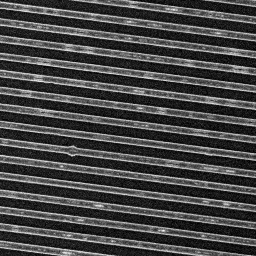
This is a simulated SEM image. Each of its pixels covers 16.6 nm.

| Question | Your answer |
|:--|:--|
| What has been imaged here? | parallel lines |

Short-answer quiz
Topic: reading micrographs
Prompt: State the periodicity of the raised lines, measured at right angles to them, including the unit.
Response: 281 nm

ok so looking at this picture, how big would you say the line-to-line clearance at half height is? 162 nanometres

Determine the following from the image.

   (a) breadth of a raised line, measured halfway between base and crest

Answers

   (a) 113 nm